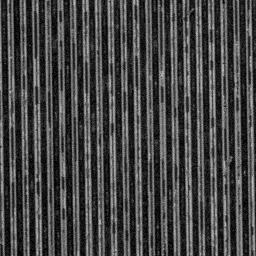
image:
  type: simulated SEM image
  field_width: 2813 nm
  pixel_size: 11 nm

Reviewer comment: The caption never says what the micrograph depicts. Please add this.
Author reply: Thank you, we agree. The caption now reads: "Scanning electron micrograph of parallel lines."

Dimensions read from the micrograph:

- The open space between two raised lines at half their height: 89.3 nm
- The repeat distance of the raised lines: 0.138 um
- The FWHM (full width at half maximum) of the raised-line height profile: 49.5 nm